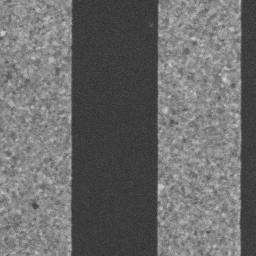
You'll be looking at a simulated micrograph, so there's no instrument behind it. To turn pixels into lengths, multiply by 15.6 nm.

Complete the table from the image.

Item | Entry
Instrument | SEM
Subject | one or a few lines or trenches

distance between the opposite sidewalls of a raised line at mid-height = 1280 nm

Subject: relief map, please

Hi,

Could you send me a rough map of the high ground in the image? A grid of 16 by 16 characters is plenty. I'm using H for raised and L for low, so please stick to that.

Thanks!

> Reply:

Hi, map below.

HHHHLLLLLLHHHHHL
HHHHLLLLLLHHHHHL
HHHHLLLLLLHHHHHL
HHHHLLLLLLHHHHHL
HHHHLLLLLLHHHHHL
HHHHLLLLLLHHHHHL
HHHHLLLLLLHHHHHL
HHHHLLLLLLHHHHHL
HHHHLLLLLLHHHHHL
HHHHLLLLLLHHHHHL
HHHHLLLLLLHHHHHL
HHHHLLLLLLHHHHHL
HHHHLLLLLLHHHHHL
HHHHLLLLLLHHHHHL
HHHHLLLLLLHHHHHL
HHHHLLLLLLHHHHHL